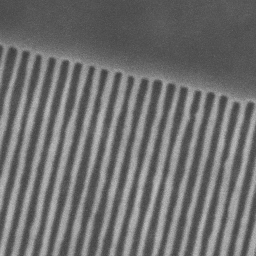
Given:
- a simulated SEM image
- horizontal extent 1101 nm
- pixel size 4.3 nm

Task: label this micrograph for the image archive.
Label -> parallel lines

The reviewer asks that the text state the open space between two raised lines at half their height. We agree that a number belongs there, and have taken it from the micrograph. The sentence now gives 34.1 nanometres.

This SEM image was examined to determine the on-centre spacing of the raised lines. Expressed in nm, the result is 58.3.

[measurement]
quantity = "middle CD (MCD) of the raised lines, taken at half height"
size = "0.0231 µm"